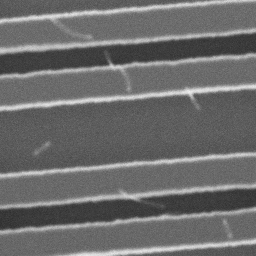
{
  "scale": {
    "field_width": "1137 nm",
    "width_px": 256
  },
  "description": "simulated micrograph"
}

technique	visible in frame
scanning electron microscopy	lines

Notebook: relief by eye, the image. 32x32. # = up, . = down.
........................########
..........######################
################################
################################
##########################......
##############..................
#...............................
.......................#########
...........#####################
################################
################################
##########################......
#############...................
###.............................
................................
................................
................................
................................
................................
..........................######
................################
...#############################
################################
################################
###################.............
########........................
.............................###
...............#################
...#.###########################
################################
##############################..
###################.............